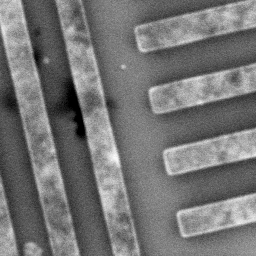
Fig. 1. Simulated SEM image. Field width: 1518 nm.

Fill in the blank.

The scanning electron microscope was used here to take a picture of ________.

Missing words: groups of lines, slits or small figures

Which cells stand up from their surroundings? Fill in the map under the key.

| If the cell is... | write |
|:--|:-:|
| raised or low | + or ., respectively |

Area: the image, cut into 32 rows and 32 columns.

+++....+++...................+++
+++....+++...............+++++++
+++.....+++..........+++++++++++
+++.....+++......++++++++++++++.
+++.....+++......+++++++++......
.+++....+++......+++++..........
.+++.....+++....................
.+++.....+++....................
.+++.....+++..................++
..+++....+++..............++++++
..+++....++++........+++++++++++
..+++.....+++......++++++++++++.
..+++.....+++......++++++++.....
...+++....+++......++++.........
...+++....+++...................
...+++.....+++..................
...+++.....+++................++
...+++.....+++............++++++
....+++....+++........++++++++++
....+++....++++......+++++++++++
....+++.....+++......++++++.....
....+++.....+++......++.........
.....+++....+++.................
.....+++....++++................
+....+++.....+++...............+
+....+++.....+++...........+++++
+....++++....+++.......+++++++++
+.....+++....+++......++++++++++
+.....+++.....+++......+++++....
++....+++.....+++...............
++....++++....+++...............
++.....+++....+++...............